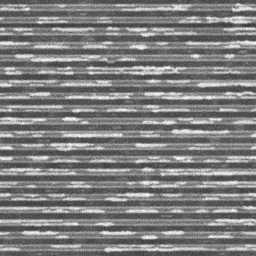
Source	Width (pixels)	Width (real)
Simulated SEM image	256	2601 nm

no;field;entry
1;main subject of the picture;parallel lines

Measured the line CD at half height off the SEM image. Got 5.99 px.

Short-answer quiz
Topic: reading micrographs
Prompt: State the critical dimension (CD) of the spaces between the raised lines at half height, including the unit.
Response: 69.8 nm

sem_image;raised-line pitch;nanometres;128